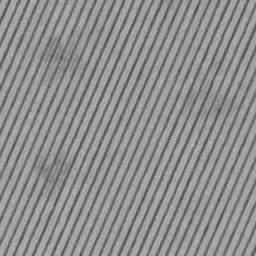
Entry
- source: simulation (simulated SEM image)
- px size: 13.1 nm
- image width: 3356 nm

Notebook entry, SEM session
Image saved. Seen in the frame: parallel lines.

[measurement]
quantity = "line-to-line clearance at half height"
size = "39.1 nanometers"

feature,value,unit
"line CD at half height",76.7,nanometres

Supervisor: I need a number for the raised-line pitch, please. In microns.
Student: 0.115